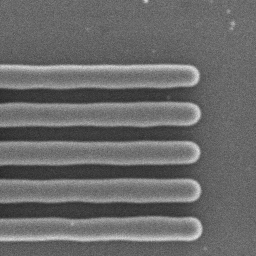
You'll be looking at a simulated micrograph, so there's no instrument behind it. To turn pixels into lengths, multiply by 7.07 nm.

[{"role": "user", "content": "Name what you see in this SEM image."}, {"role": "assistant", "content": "groups of lines, slits or small figures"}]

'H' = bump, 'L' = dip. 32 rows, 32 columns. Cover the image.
LLLLLLLLLLLLLLLLLLLLLLLLLLLLLLLL
LLLLLLLLLLLLLLLLLLLLLLLLLLLLLLLL
LLLLLLLLLLLLLLLLLLLLLLLLLLLLLLLL
LLLLLLLLLLLLLLLLLLLLLLLLLLLLLLLL
LLLLLLLLLLLLLLLLLLLLLLLLLLLLLLLL
LLLLLLLLLLLLLLLLLLLLLLLLLLLLLLLL
LLLLLLLLLLLLLLLLLLLLLLLLLLLLLLLL
LLLLLLLLLLLLLLLLLLLLLLLLLLLLLLLL
HHHHHHHHHHHHHHHHHHHHHHHHLLLLLLLL
HHHHHHHHHHHHHHHHHHHHHHHHHLLLLLLL
HHHHHHHHHHHHHHHHHHHHHHHHLLLLLLLL
LLLLLLLLLLLLLLLLLLLLLLLLLLLLLLLL
LLLLLLLLLLLLLLLLLLLLLLLLLLLLLLLL
HHHHHHHHHHHHHHHHHHHHHHHHHLLLLLLL
HHHHHHHHHHHHHHHHHHHHHHHHHLLLLLLL
HHHHHHHHHHHHHHHHHHHHHHHHLLLLLLLL
LLLLLLLLLLLLLLLLLLLLLLLLLLLLLLLL
LLLLLLLLLLLLLLLLLLLLLLLLLLLLLLLL
HHHHHHHHHHHHHHHHHHHHHHHHHLLLLLLL
HHHHHHHHHHHHHHHHHHHHHHHHHLLLLLLL
HHHHHHHHHLLLLLHHHLLLLLLLLLLLLLLL
LLLLLLLLLLLLLLLLLLLLLLLLLLLLLLLL
HLLLLLLLLLLLHHHHHHHHHHHHLLLLLLLL
HHHHHHHHHHHHHHHHHHHHHHHHHLLLLLLL
HHHHHHHHHHHHHHHHHHHHHHHHHLLLLLLL
LLLLLLLLLLLLLLLLLLLLLLLLLLLLLLLL
LLLLLLLLLLLLLLLLLLLLLLLLLLLLLLLL
HHHHHHHHHHHHHHHHHHHHHHHHHLLLLLLL
HHHHHHHHHHHHHHHHHHHHHHHHHLLLLLLL
HHHHHHHHHHHHHHHHHHHHHHHHHLLLLLLL
LLLLLLLLLLLLLLLLLLLLLLLLLLLLLLLL
LLLLLLLLLLLLLLLLLLLLLLLLLLLLLLLL